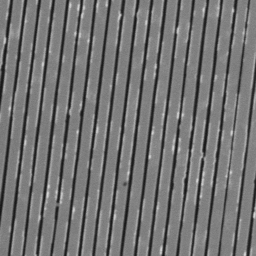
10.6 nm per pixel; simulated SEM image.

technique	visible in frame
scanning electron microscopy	parallel lines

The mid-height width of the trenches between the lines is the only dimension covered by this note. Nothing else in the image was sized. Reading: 36.6 nm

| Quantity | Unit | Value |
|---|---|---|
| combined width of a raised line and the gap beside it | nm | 147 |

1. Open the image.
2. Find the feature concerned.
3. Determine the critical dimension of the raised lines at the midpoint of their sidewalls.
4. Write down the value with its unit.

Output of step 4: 0.11 micrometres